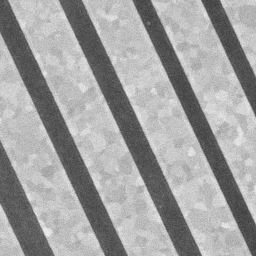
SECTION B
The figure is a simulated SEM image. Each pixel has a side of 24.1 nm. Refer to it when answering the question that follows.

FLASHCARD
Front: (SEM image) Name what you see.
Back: lines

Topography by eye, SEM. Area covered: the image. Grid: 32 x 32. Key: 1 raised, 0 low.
01111110000111111001111110001111
00111111000111111000111111001111
00111111000111111100111111000111
00011111100011111100011111100111
00011111100011111110011111100011
10001111110001111110001111110011
10001111110001111110001111110001
11000111111000111111001111111001
11000111111000111111000111111000
11000011111100011111100111111000
11100011111100011111100011111100
11100011111110001111110011111100
11110001111110001111110001111110
11110001111111000111111001111110
11111000111111000111111000111111
11111000111111100011111100111111
11111100011111100011111100011111
11111100011111100001111110011111
01111110001111110001111110001111
01111110001111110001111111001111
01111111000111111000111111000111
00111111000111111000111111100111
00111111100011111100011111100111
00011111100011111100011111100011
00011111110001111110001111110011
00001111110001111110001111110001
00001111110001111111000111111001
10000111111000111111000111111000
10000111111000111111100011111100
11000011111100011111100011111100
11000011111100011111110001111110
11100001111110001111110001111110